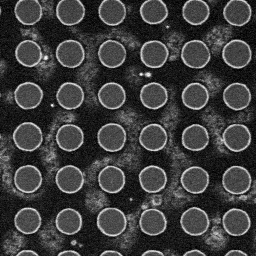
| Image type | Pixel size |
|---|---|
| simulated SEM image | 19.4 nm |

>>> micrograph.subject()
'a regular array of raised bodies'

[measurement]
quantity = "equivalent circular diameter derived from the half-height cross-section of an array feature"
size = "515 nm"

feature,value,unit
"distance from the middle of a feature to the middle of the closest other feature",802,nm